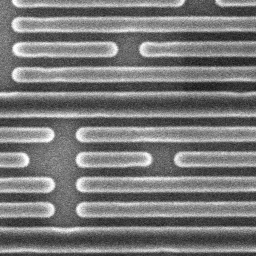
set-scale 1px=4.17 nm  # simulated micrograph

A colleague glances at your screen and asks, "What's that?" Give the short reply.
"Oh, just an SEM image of groups of lines, slits or small figures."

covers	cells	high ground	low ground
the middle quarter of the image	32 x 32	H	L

LLLLLLLLLLLLLLLLLLLLLLLLLLLLLLLL
HHHHHHHHHHHHHHHHHHHHHHHHHHHHHHHH
HHHHHHHHHHHHHHHHHHHHHHHHHHHHHHHH
HHHHHHHHHHHHHHHHHHHHHHHHHHHHHHHH
LLLLLLLLLLLLLLLLLLLLLLLLLLLLLLLL
LLLLLLLLLLLLLLLLLLLLLLLLLLLLLLLL
LLLLLLLLLLLLLLLLLLLLLLLLLLLLLLLL
HHHHHHHHHHHHHHLHHHHHHHHHHHHHHHHH
HHHHHHHHHHHHHHHHHHHHHHHHHHHHHHHH
HHHHHHHHHHHHHHHHHHHHHHHHHHHHHHHH
HHHHHHHHHHHHHHHHHHHHHHHHHHHHHHHH
HHHHHHHHHHHHHHHHHHHHHHHHHHHHHHHH
HHHHHHHHHHHHHHHHHHHHHHHHHHHHHHHH
LLLLLLLLLLLLLLLLLLLLLLLLLLLLLLLL
LLLLLLLLLLLLLLLLLLLLLLLLLLLLLLLL
LLLLLLLLLLLLLLLLLLLLLLLLLLLLLLLL
LLLLHHHHHHHHHHHHHHHHHHHHHHHHHHHH
LLLHHHHHHHHHHHHHHHHHHHHHHHHHHHHH
LLLHHHHHHHHHHHHHHHHHHHHHHHHHHHHH
LLLLLLLLLLLLLLLLLLLLLLLLLLLLLLLL
LLLLLLLLLLLLLLLLLLLLLLLLLLLLLLLL
LLLLLLLLLLLLLLLLLLLLLLLLLLLLLLLL
LLLLHHHHHHHHHHHHHHHHHLLLLLLLHHHH
LLLHHHHHHHHHHHHHHHHHHLLLLLLLHHHH
LLLHHHHHHHHHHHHHHHHHHLLLLLLLHHHH
LLLLHHHHHHHHHHHLLLLLLLLLLLLLLLLL
LLLLLLLLLLLLLLLLLLLLLLLLLLLLLLLL
LLLLLLLLLLLLLLLLLLLLLLLLLLLLLLLL
LLLLLLLLLLLLLLLLLLLLLLLHHHLHHHHH
LLLHHHHHHHHHHHHHHHHHHHHHHHHHHHHH
LLLHHHHHHHHHHHHHHHHHHHHHHHHHHHHH
LLLLHHHHHHHHHHHHHHHHHHHHHHHHHHHH